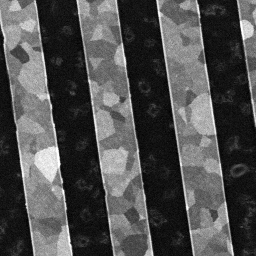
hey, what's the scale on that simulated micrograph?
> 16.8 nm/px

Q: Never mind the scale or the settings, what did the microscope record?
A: one or a few lines or trenches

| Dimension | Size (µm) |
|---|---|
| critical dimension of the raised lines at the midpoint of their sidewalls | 0.646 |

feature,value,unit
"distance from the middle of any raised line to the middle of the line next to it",1330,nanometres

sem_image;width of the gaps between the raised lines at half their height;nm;681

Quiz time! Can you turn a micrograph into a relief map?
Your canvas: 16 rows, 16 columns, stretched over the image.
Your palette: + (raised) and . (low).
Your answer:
++...++...++...+
++...++...+++..+
+++..+++..+++..+
+++..+++..+++..+
.++..+++..+++...
.++...++...++...
.++...++...++...
.++...++...++...
.++...++...+++..
.+++..+++..+++..
.+++..+++..+++..
..++...++..+++..
..++...++...++..
..++...++...++..
..++...++...++..
..++...+++..++..